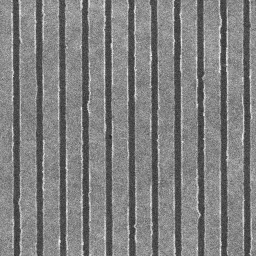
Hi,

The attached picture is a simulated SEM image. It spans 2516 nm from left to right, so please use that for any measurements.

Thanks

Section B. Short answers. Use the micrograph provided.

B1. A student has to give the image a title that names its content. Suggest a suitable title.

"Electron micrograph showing parallel lines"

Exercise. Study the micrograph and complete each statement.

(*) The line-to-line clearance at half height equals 70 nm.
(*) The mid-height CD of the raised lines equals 157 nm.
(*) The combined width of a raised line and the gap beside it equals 226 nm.